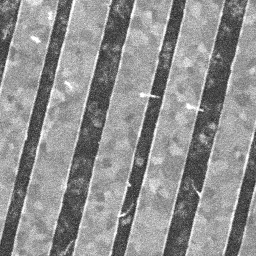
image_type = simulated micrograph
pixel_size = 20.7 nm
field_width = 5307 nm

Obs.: parallel lines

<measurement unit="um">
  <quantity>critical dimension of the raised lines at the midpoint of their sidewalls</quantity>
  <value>0.745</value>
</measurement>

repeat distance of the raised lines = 1150 nm